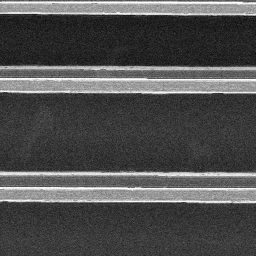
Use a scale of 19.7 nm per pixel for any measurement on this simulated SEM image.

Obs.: lines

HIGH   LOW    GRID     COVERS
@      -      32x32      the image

@@@@@@@@@@@@@@@@@@@@@@@@@@@@@@@@
@@@@@@@@@@@@@@@@@@@@@@@@@@@@@@@@
--------------------------------
--------------------------------
--------------------------------
--------------------------------
--------------------------------
--------------------------------
--------------------------------
@@@@@@@@@@@@@@@@@@@@@@@@@@@@@@@@
@@@@@@@@@@@@@@@@@@@@@@@@@@@@@@@@
--------------@-@@@@@@@@@@@@@@@@
--------------------------------
--------------------------------
--------------------------------
--------------------------------
--------------------------------
--------------------------------
--------------------------------
--------------------------------
--------------------------------
--------------------------------
@@@@@@@@@@@@@@@@@@@@@@@@@@@@@@@@
@@@@@@@@@@@@@@@@@@@@@@@@@@@@@@@@
@@@@@@@@@@@@@@@@@@@@@@@@@@@@@@@@
--------------------------------
--------------------------------
--------------------------------
--------------------------------
--------------------------------
--------------------------------
--------------------------------